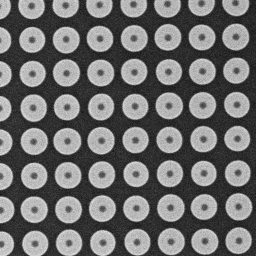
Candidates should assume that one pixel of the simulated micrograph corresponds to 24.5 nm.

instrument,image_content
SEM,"an array of small figures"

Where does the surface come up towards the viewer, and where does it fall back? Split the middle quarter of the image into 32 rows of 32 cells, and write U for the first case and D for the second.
UUUDDDUUUUUUDDDUUUUUDDDUUUUUUDDD
UUUUDDUUUUUUDDUUUUUUUDDUUUUUUDDU
UUUUDDUUUUUUDDUUUUUUUDDUUUUUUDDU
UUUUDDUUUUUUDDDUUUUUDDDDUUUUUDDD
UUUDDDDUUUUUDDDUUUUDDDDDUUUUDDDD
DDDDDDDDDDDDDDDDDDDDDDDDDDDDDDDD
DDDDDDDDDDDDDDDDDDDDDDDDDDDDDDDD
DDDDDDDDDDDDDDDDDDDDDDDDDUUUDDDD
UUUDDDDUUUUUDDDDUUUUDDDDUUUUUDDD
UUUDDDUUUUUUDDDUUUUUUDDUUUUUUDDU
UUUUDDUUUUUUDDDUUUUUUDDUUUUUUUDU
UUUUDDUUUUUUDDDUUUUUUDDUUUUUUDDD
UUUDDDDUUUUUDDDUUUUUDDDDUUUUUDDD
UUDDDDDUUUUDDDDDUUUDDDDDDUUUDDDD
DDDDDDDDDDDDDDDDDDDDDDDDDDDDDDDD
DDDDDDDDDDDDDDDDDDDDDDDDDDDDDDDD
UUDDDDDUUUUDDDDDUUUUDDDDUUUUDDDD
UUUUDDUUUUUUDDDUUUUUUDDDUUUUUDDD
UUUUDDUUUUUUDDDUUUUUUDDUUUUUUDDD
UUUUDDUUUUUUDDDUUUUUUDDUUUUUUDDD
UUUUDDUUUUUUDDDUUUUUUDDDUUUUUDDD
UUUDDDDUUUUUDDDDUUUUDDDDUUUUDDDD
DDDDDDDDDDDDDDDDDDDDDDDDDDDDDDDD
DDDDDDDDDDDDDDDDDDDDDDDDDDDDDDDD
DDDDDDDDDDDDDDDDDDDDDDDDDUUUDDDD
UUUDDDDUUUUUDDDDUUUUDDDDUUUUUDDD
UUUUDDUUUUUUDDDUUUUUUDDUUUUUUDDD
UUUUDDUUUUUUUDDUUUUUUDDUUUUUUUDD
UUUUDDUUUUUUUDDUUUUUUDDUUUUUUDDD
UUUUDDDUUUUUDDDDUUUUDDDDUUUUUDDD
UUUDDDDDUUUDDDDDDUUDDDDDDUUDDDDD
DDDDDDDDDDDDDDDDDDDDDDDDDDDDDDDD